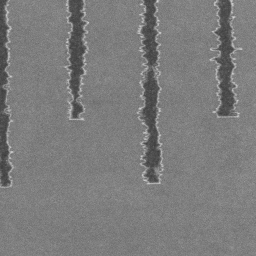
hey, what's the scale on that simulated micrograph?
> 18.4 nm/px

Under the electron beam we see one or a few lines or trenches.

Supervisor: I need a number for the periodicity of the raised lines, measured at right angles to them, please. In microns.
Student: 1.36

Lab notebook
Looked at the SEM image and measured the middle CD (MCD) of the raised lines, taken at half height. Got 0.259 µm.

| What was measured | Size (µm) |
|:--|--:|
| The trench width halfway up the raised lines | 1.1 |